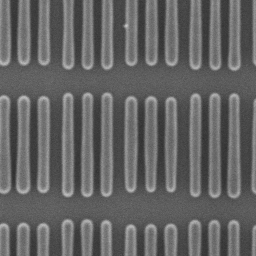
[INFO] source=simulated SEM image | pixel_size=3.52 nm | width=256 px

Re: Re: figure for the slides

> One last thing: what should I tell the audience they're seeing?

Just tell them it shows groups of lines, slits or small figures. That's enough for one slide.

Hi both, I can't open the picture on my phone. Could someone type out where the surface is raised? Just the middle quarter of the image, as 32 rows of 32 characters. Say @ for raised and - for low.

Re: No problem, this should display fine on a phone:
@@---@@---@@--------------------
--------------------------------
--------------------------------
--------------------------------
--------------------------------
--------------------------------
--------------------------------
-@---@----@---------------------
@@---@@---@@----@@---@----@-----
@@---@@---@@----@@---@@---@@----
@@---@@---@@----@@---@@---@@----
@@---@@---@@----@@---@@---@@----
@@---@@---@@----@@---@@---@@----
@@---@@--@@@----@@---@@---@@----
@@---@@--@@@---@@@---@@--@@@----
@@---@@--@@@---@@@---@@--@@@----
@@---@@--@@@---@@@--@@@--@@@----
@@---@@--@@@---@@@--@@@--@@@----
@@---@@--@@@---@@@--@@@--@@@----
@@---@@--@@@---@@@--@@@--@@@----
@@---@@--@@@---@@@--@@@--@@@----
@@---@@--@@@---@@@--@@@--@@@----
@@---@@--@@@---@@@--@@@--@@@----
@@---@@--@@@---@@@---@@--@@@----
@@---@@--@@@---@@@---@@--@@@----
@@---@@--@@@---@@@---@@---@@----
@@---@@--@@@---@@@---@@---@@----
@@---@@--@@@---@@@---@@---@@----
@@---@@--@@@----@@---@@---@@----
@@---@@--@@@----@@---@@---@@----
@@---@@--@@@----@@---@@---@@----
@@---@@--@@@----@@---@----@@----